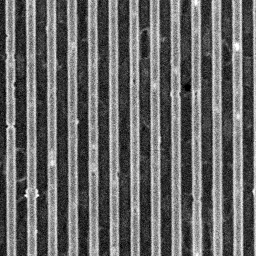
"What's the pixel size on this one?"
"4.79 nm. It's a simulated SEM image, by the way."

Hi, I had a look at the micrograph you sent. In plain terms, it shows parallel lines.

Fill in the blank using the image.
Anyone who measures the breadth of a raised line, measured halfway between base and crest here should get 40.1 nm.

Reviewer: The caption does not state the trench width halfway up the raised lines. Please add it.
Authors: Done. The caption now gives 58.1 nanometers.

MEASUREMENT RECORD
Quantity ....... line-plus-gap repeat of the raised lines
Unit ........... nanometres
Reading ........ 98.9